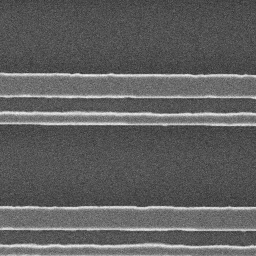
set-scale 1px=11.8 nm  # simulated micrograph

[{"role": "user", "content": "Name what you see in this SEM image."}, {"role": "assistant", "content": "lines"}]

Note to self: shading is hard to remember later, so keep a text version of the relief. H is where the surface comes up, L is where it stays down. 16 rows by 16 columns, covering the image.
LLLLLLLLLLLLLLLL
LLLLLLLLLLLLLLLL
LLLLLLLLLLLLLLLL
LLLLLLLLLLLLLLLL
LLLLLLLLLLLLLLLL
HHHHHHHHHHHHHHHH
HHHHHHHHHHHHHHHH
HHHHHHHHHHHHHHHH
LLLLLLLLLLLLLLLL
LLLLLLLLLLLLLLLL
LLLLLLLLLLLLLLLL
LLLLLLLLLLLLLLLL
LLLLLLLLLLLLLLLL
HHHHHHHHHHHHHHHH
HHHHHHHHHHHHHHHH
HHHHHHHHHHHHHHHH